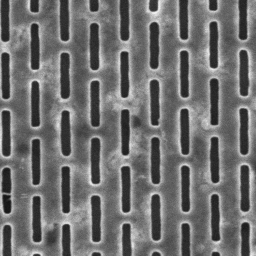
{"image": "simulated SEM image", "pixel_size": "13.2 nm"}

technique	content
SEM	a regular array of holes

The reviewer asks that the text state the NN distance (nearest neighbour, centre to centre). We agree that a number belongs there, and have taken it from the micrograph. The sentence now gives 0.54 microns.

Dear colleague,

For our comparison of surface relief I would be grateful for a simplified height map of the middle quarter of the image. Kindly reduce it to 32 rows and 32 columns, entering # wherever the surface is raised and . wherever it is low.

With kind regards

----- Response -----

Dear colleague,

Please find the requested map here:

..####...#####..######..#####..#
.######.######..#############..#
.#############..#############..#
..############..#############..#
..#####..#####..#####...#####..#
..####...#####..#####...#####..#
..####...#####..#####...#####..#
..####...#####..#####...#####..#
.#####...######.#####...########
######...############...########
######...############...########
.#####...######.#####...#####..#
.#####...#####..#####...#####..#
.#####...#####..#####...#####..#
..####...#####..######..#####..#
..#####..#####..#############..#
..############...############..#
..############...############..#
..#####.######...#####..#####..#
..#####..#####...#####..#####..#
..#####..#####..######..#####...
..#####..#####...#####..#####...
..#####..######.######..######.#
#######..#############..########
#######..#############..########
.######..######.######..######.#
..#####..#####...#####..#####...
..#####..#####...#####..#####...
..#####..#####...#####..#####...
..#####..#####...#####..#####...
..############...############...
..############...############...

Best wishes